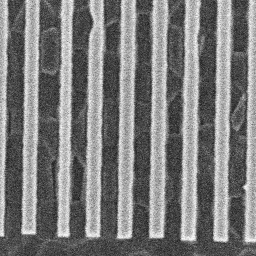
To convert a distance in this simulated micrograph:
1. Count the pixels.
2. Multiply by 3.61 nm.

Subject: parallel lines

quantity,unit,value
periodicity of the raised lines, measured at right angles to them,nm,116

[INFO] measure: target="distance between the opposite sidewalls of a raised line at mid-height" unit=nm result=48.8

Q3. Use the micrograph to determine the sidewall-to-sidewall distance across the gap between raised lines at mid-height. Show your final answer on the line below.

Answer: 66.8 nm